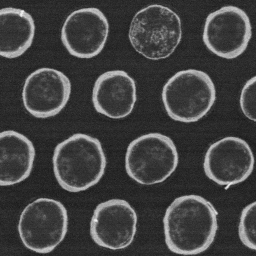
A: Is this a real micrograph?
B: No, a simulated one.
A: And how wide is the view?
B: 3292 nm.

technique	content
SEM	a regular array of raised bodies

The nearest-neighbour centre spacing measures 923 nm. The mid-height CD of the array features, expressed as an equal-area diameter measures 46.4 pixels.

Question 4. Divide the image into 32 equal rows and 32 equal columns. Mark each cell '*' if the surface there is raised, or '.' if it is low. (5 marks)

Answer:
................................
.**.......**...............***..
****....*****.............*****.
****....*****.............*****.
****....*****.............*****.
****....*****.............*****.
***......***...............***..
................................
................................
....****.....***......****......
...*****....*****....*****.....*
...*****....*****....******...**
...*****....*****....******...**
...****.....****.....*****....**
..............*.......***......*
................................
................................
***......**......****.......**..
****...*****....******....*****.
****...******...******....*****.
****...******...******....******
***....******...*****.....*****.
***.....****.....***.......***..
.........**.....................
................................
....***......***......****......
...*****....*****....*****.....*
...*****....*****....******...**
...*****....*****....******...**
...*****....*****....******...**
...****......***.....*****.....*
................................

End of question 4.